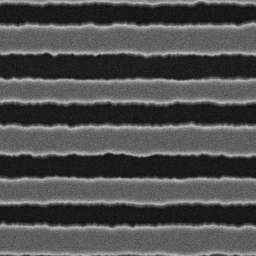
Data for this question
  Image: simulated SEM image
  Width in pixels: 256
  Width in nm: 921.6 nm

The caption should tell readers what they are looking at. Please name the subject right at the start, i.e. lines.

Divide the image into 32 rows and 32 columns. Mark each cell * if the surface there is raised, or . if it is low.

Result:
.....*............**..........*.
................................
................................
********************************
********************************
********************************
********************************
................................
................................
................................
********************************
********************************
********************************
................................
................................
.......................*........
********************************
********************************
********************************
.................**.........****
................................
................................
*.******************************
********************************
********************************
....**..........*****.......*...
................................
................................
********************************
********************************
********************************
********************************